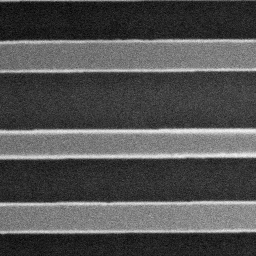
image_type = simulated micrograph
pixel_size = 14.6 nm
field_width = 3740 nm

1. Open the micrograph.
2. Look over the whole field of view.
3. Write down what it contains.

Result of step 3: lines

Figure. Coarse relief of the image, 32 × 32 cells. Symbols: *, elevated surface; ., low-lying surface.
................................
................................
................................
................................
................................
********************************
********************************
********************************
********************************
................................
................................
................................
................................
................................
................................
................................
********************************
********************************
********************************
********************************
................................
................................
................................
................................
................................
********************************
********************************
********************************
********************************
................................
................................
................................